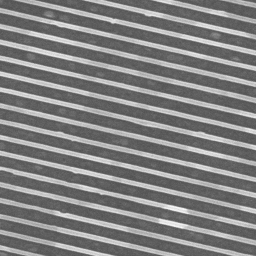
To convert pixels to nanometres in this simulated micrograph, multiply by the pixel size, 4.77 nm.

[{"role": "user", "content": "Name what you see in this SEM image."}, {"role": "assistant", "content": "parallel lines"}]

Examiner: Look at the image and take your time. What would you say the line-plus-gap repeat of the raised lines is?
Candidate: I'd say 73.5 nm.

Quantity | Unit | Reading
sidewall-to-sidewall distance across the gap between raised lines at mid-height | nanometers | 58.6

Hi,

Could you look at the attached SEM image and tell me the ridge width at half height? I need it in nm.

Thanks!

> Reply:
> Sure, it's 18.